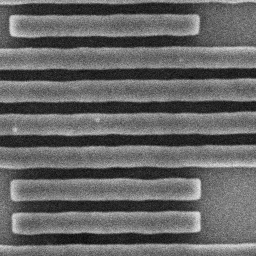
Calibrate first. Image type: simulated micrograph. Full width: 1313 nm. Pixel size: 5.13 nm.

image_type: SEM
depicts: groups of lines, slits or small figures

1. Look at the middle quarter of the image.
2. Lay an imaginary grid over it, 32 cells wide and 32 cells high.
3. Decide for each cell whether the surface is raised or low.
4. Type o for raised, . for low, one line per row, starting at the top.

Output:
oooooooooooooooooooooooooooooooo
................................
................................
................................
oooooooooooooooooooooooooooooooo
oooooooooooooooooooooooooooooooo
oooooooooooooooooooooooooooooooo
oooooooooooooooooooooooooooooooo
oooooooooooooooooooooooooooooooo
................................
................................
................................
.................oooooooooo..ooo
oooooooooooooooooooooooooooooooo
oooooooooooooooooooooooooooooooo
oooooooooooooooooooooooooooooooo
oooooooooooooooooooooooooooooooo
oooooo..........................
................................
................................
................................
oooooooooooooooooooooooooooooooo
oooooooooooooooooooooooooooooooo
oooooooooooooooooooooooooooooooo
oooooooooooooooooooooooooooooooo
oooooooooooooooooooo..ooooooooo.
................................
................................
................................
oooooooooooooooooooooooooooooooo
oooooooooooooooooooooooooooooooo
oooooooooooooooooooooooooooooooo